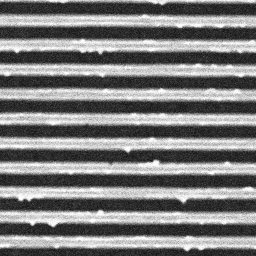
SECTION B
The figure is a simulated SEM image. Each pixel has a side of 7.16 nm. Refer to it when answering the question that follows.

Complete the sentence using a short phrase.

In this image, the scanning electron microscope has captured parallel lines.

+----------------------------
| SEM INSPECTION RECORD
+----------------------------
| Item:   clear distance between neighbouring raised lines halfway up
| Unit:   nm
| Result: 109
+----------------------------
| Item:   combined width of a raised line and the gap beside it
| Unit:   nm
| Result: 176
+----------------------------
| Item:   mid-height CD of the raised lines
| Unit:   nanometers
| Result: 67.2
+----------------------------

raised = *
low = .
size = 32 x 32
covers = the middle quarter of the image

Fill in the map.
***********..................**.
********************************
********************************
................................
................................
................................
****......*............***......
********************************
********************************
................................
................................
................................
.................*......*.......
********************************
********************************
................................
................................
................................
................................
********************************
********************************
...............**...............
................................
................................
......................**........
********************************
********************************
................................
................................
................................
................................
********************************